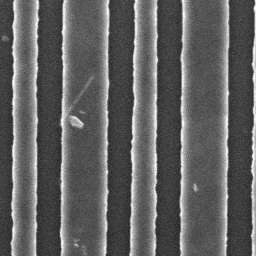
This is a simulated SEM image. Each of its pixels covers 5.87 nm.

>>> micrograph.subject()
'lines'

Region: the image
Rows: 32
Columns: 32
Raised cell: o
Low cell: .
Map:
..ooo...oooooo...ooo...oooooo...
..ooo...oooooo...ooo...oooooo...
..ooo...oooooo...ooo...oooooo...
..ooo...oooooo...ooo...oooooo...
..ooo...oooooo...ooo...oooooo...
..ooo...ooooo....ooo...oooooo...
..ooo...ooooo....ooo...ooooo....
..ooo...ooooo....ooo...ooooo....
..ooo...ooooo....ooo...ooooo....
..ooo...ooooo....ooo...ooooo....
..ooo...oooooo...ooo...ooooo....
..ooo...ooooo....ooo...oooooo...
..ooo...ooooo....ooo...ooooo....
..ooo...ooooo....ooo...ooooo....
..ooo...ooooo....ooo...ooooo....
..ooo...ooooo....ooo...ooooo....
..ooo...ooooo....ooo...ooooo....
..ooo...ooooo....ooo...ooooo....
..ooo...ooooo...ooo....ooooo....
..ooo...ooooo...oooo...ooooo....
..ooo...ooooo....ooo...ooooo....
..ooo...ooooo....ooo...ooooo....
..ooo...ooooo...oooo...ooooo....
..ooo...ooooo...ooo....ooooo...o
..ooo...ooooo...oooo...ooooo....
..ooo...ooooo...oooo...ooooo....
..oo....ooooo...oooo...ooooo....
..ooo...ooooo...ooo....ooooo....
..ooo...ooooo...ooo....ooooo....
..oo....ooooo...ooo....ooooo...o
.ooo....ooooo...ooo....ooooo....
..oo....ooooo...ooo....ooooo....